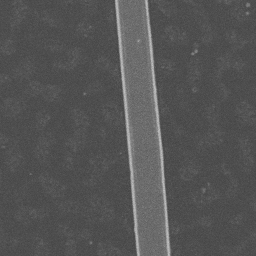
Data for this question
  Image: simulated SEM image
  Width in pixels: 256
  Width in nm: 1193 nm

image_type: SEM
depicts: one or a few lines or trenches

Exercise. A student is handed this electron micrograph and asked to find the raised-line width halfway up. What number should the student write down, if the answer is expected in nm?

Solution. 139